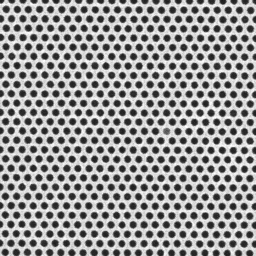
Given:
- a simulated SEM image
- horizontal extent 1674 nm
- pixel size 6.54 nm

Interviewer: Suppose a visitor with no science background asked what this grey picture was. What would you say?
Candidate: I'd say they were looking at a regular array of holes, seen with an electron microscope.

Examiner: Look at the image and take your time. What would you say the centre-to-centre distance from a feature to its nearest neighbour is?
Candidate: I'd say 68.9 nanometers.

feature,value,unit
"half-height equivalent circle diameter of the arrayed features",51.6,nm